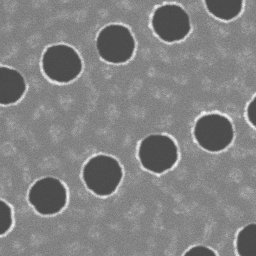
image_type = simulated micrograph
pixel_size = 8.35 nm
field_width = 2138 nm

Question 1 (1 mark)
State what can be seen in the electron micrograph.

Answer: holes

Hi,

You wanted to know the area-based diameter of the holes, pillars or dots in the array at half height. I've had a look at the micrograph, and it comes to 321 nanometres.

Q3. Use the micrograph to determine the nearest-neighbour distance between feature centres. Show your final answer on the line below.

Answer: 491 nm